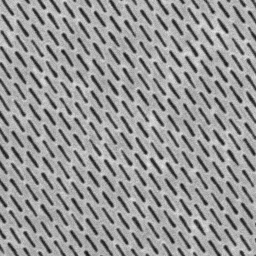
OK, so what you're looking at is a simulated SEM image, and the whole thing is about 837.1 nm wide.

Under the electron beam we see a regular array of holes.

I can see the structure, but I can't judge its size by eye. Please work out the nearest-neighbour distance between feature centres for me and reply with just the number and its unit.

15.1 pixels